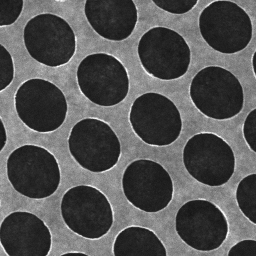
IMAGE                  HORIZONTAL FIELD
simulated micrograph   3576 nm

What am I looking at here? a regular array of holes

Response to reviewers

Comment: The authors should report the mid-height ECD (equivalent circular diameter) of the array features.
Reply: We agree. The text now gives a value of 728 nm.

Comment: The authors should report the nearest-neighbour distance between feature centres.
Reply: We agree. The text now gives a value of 924 nm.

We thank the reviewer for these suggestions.